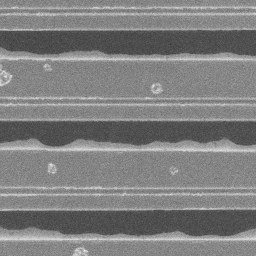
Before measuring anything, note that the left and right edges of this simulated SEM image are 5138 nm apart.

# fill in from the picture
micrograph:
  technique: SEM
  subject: lines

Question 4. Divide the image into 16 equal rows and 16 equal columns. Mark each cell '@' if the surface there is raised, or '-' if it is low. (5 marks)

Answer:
@@@@@@@@@@@@@@@@
@@@@@@@@@@@@@@@@
----------------
@---------------
@@@@@@@@@@@@@@@@
@@@@@@@@@@@@@@@@
@@@@@@@@@@@@@@@@
----------------
----------------
@@@@@@@@@@@@@@@@
@@@@@@@@@@@@@@@@
@@@@@@@@@@@@@@@@
@@@@@@@@@@@@@@@@
----------------
----------------
@@@@@@@@@@@@@@@@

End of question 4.